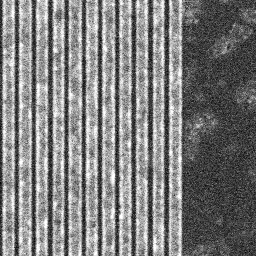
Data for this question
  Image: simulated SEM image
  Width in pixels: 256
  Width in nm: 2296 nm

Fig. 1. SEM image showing parallel lines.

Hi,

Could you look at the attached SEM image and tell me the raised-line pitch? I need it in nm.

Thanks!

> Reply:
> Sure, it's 149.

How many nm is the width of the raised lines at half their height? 93.1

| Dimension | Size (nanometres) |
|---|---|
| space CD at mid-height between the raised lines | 59.4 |